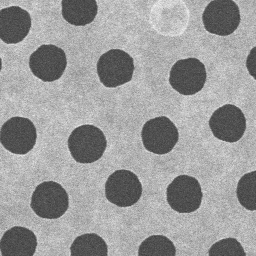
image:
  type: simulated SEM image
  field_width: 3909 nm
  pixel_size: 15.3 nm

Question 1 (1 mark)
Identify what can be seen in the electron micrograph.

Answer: a regular array of holes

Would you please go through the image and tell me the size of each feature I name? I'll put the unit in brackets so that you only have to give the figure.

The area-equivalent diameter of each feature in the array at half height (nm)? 577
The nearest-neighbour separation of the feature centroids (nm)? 943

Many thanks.